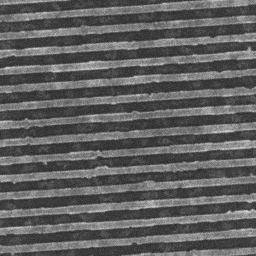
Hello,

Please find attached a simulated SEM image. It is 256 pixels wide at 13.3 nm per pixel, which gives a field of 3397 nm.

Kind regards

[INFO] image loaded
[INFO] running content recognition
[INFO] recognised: parallel lines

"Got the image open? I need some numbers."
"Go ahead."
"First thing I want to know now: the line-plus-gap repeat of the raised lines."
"0.236 µm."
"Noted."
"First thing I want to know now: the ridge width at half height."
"77.8 nanometers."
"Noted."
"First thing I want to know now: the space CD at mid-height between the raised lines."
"154 nm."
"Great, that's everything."